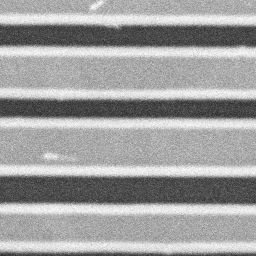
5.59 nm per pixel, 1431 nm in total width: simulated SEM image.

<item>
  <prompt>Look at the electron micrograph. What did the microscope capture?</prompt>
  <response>one or a few lines or trenches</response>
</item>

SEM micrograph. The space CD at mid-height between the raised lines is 0.171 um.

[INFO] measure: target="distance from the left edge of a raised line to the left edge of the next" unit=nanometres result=434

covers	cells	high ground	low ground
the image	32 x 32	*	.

********************************
********************************
.............*******************
................................
................................
................................
*************************....**.
********************************
********************************
********************************
********************************
********************************
................................
................................
................................
********************************
********************************
********************************
********************************
********************************
********************************
................................
................................
................................
................................
................................
********************************
********************************
********************************
********************************
********************************
................................